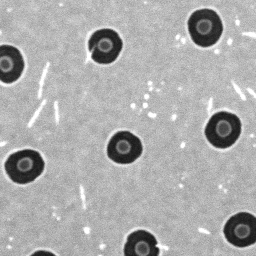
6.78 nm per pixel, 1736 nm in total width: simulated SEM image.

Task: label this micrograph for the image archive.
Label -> ring-shaped grooves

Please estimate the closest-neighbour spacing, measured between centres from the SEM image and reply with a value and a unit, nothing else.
692 nanometres